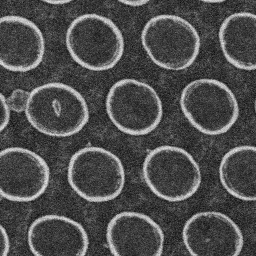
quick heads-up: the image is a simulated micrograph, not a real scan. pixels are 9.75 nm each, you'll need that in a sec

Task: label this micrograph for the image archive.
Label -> raised bodies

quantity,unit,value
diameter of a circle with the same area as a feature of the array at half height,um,0.514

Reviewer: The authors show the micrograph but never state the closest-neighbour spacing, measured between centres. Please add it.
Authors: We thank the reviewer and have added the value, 736 nm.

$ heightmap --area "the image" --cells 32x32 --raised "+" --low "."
................................
................................
+++.......+++......++++......+++
++++.....+++++....++++++....++++
+++++...+++++++...+++++++...++++
+++++....++++++...+++++++...++++
+++++....++++++....++++++...++++
+++++.....+++++....+++++.....+++
.+++.......++........+..........
................................
...............+++......+++.....
....+++++.....+++++....++++++...
..++++++++....++++++...++++++...
+..++++++++..+++++++...+++++++..
+..++++++++...++++++....+++++...
+...++++++.....++++.....+++++...
.....++++.......++........+.....
................................
..............................+.
++++.....+++++.....+++++....++++
+++++....++++++...++++++....++++
++++++...++++++...+++++++...++++
++++++...++++++...+++++++...++++
+++++....++++++....+++++....++++
.+++......++++......+++.......++
................................
................................
.....+++......+++++.....+++++...
....++++++....++++++...++++++...
+...+++++++...++++++...+++++++..
+...+++++++...++++++...+++++++..
+...+++++++...++++++....++++++..